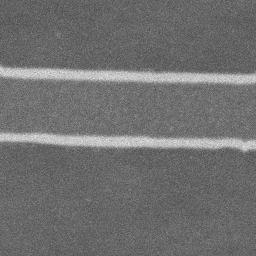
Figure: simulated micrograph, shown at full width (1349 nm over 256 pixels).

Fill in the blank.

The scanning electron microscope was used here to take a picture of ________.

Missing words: one or a few lines or trenches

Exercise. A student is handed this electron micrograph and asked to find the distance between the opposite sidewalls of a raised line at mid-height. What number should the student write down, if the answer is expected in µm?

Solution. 0.344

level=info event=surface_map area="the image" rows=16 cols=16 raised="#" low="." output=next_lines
................
................
................
................
................
################
################
################
################
................
................
................
................
................
................
................